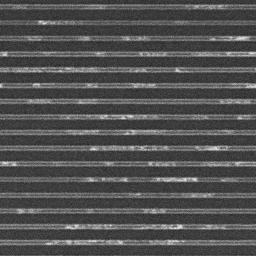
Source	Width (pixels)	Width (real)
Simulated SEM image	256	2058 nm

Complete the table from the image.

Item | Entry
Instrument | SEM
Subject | parallel lines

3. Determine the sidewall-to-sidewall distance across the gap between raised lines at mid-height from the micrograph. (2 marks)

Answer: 95.5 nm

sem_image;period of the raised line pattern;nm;126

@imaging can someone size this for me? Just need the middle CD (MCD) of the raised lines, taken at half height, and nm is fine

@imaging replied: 30.1